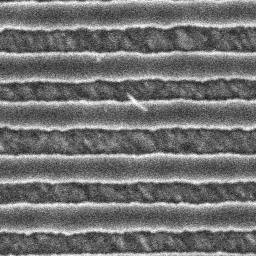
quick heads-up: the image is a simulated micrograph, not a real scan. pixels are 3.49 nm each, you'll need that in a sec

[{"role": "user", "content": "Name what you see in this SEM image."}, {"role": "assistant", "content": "lines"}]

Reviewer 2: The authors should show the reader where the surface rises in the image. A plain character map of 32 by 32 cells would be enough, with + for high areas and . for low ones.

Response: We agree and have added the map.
++++++++++++++++++++++++++++++++
++++++++++++++++++++++++++++++++
++++++++++++++++++++++++++++++++
++++++++++.+++++....+...........
......................+.........
......................++........
.......+.......+.....+++++++....
++++++++++++++++++++++++++++++++
++++++++++++++++++++++++++++++++
++++++++++++++++++++++++++++++++
................................
................................
................+.....+......+..
++++++++++++++++++++++++++++++++
++++++++++++++++++++++++++++++++
++++++++++++++++++++++++++++++++
................................
................................
................................
++++++++++++++++++++++++++++++++
++++++++++++++++++++++++++++++++
++++++++++++++++++++++++++++++++
++++++++++++++++++++++++++++++++
................................
................................
.+++.+++++++++++++++++++.+++++++
++++++++++++++++++++++++++++++++
++++++++++++++++++++++++++++++++
++++++++++++++++++++++++++++++++
................................
................................
................................